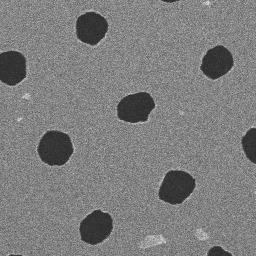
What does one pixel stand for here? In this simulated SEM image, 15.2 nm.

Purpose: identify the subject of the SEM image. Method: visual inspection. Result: holes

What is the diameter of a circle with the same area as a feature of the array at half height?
510 nanometres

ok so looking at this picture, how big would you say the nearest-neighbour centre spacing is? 1360 nanometers